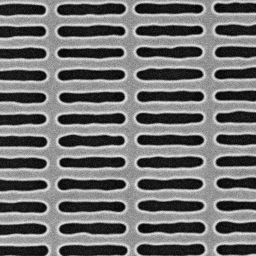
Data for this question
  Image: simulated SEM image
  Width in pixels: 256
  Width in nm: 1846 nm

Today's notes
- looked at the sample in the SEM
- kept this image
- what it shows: groups of lines, slits or small figures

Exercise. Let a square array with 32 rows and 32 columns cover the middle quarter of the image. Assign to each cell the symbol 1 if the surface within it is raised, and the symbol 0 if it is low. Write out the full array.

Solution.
11111111111111111111111111111111
10000000000000111111000000000000
00000000000000011100000000000000
00000000000000011100000000000000
11111111111111111111111111111111
11111111111111111111111111111111
11111111111111111111111111111111
00000000000000011100000000000000
00000000000000011100000000000000
00000000000000111110011110011011
11111111111111111111111111111111
11111111111111111111111111111111
00000000000000011100000000000000
00000000000000001100000000000000
00000000000000011100000000000000
11111111111111111111111111111111
11111111111111111111111111111111
11111111111111111111111111111111
00000000000000011100000000000000
00000000000000011100000000000000
00000000000110111111111011111110
11111111111111111111111111111111
11111111111111111111111111111111
00000000000000011110000000000000
00000000000000001100000000000000
00000000000000011100000000000000
11111111111111111111111111111111
11111111111111111111111111111111
00111111111111111111011111100000
00000000000000011100000000000000
00000000000000001100000000000000
01110000000001111111000011111000